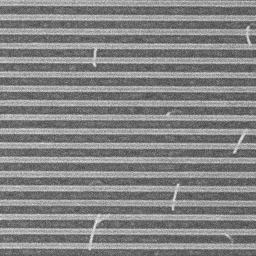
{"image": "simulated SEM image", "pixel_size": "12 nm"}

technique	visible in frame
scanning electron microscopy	parallel lines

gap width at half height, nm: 111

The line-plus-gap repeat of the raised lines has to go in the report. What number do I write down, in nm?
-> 171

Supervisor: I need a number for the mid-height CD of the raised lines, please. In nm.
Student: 55.4